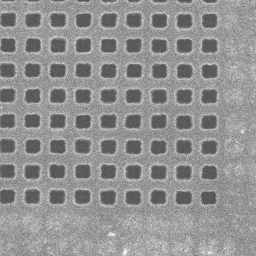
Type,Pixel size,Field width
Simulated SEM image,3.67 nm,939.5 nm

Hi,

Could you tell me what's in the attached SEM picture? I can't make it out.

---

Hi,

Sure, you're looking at a regular array of holes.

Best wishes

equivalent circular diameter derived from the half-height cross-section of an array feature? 58.3 nanometres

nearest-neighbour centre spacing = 0.0909 µm